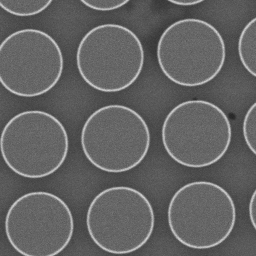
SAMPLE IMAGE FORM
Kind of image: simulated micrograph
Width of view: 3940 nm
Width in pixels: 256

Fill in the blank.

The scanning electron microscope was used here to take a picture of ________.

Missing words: an array of small figures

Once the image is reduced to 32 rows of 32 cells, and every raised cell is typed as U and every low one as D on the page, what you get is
UUUUUUDDDDDUUUUUDDDDDDUUDDDDDDDD
DUUUUDDDDDDDDDDDDDDDDDDDDDDDDDDD
DDDDDDDDDDDDDDDDDDDDDDDUUDDDDDDD
DDDDDDDDDDDDUUUUDDDDDUUUUUUDDDDU
DUUUUUDDDDDUUUUUUDDDUUUUUUUUDDUU
UUUUUUUDDDUUUUUUUUDDUUUUUUUUDDUU
UUUUUUUUDDUUUUUUUUDDUUUUUUUUDDUU
UUUUUUUUDDUUUUUUUUDDUUUUUUUUDDUU
UUUUUUUUDDUUUUUUUUDDUUUUUUUUDDDU
UUUUUUUDDDUUUUUUUDDDDUUUUUUDDDDD
UUUUUUUDDDDUUUUUDDDDDDDUUDDDDDDD
DUUUUUDDDDDDDDDDDDDDDDDDDDDDDDDD
DDDDDDDDDDDDDDDDDDDDDDDDDDDDDDDD
DDDDDDDDDDDDDUUUDDDDDDUUUUUDDDDU
DDUUUUDDDDDUUUUUUDDDDUUUUUUUDDDU
DUUUUUUUDDDUUUUUUUDDUUUUUUUUUDUU
UUUUUUUUDDUUUUUUUUUDUUUUUUUUUDDU
UUUUUUUUDDUUUUUUUUUDUUUUUUUUUDDU
UUUUUUUUDDUUUUUUUUDDDUUUUUUUDDDU
UUUUUUUUDDDUUUUUUUDDDUUUUUUUDDDD
DUUUUUUUDDDDUUUUUDDDDDDUUUDDDDDD
DDUUUUUDDDDDDDDDDDDDDDDDDDDDDDDD
DDDDDDDDDDDDDDDDDDDDDDDDDDDDDDDD
DDDDDDDDDDDDDDUUDDDDDDDUUUUUDDDD
DDDUUUUDDDDDUUUUUUDDDDUUUUUUUDDD
DDUUUUUUDDDUUUUUUUUDDUUUUUUUUDDU
DUUUUUUUUDDUUUUUUUUDDUUUUUUUUDDU
DUUUUUUUUDDUUUUUUUUDDUUUUUUUUDDU
DUUUUUUUUDDUUUUUUUUDDUUUUUUUUDDD
DUUUUUUUUDDUUUUUUUUDDDUUUUUUDDDD
DUUUUUUUDDDDUUUUUUDDDDDUUUUDDDDD
DDUUUUUDDDDDDDUUDDDDDDDDDDDDDDDD